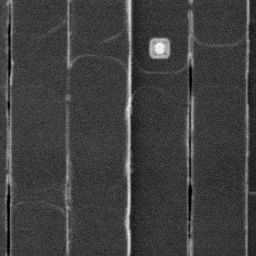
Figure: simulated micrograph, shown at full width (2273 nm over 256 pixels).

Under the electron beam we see wiring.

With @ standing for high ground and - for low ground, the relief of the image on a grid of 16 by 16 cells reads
@@@@@@@@--------
@@@@@@@@--------
@@@@@@@@--------
@@@@@@@@--------
@@@@@@@@--------
@@@@@@@@--------
@@@@@@@@--------
@@@@@@@@--------
@@@@@@@@--------
@@@@@@@@--------
@@@@@@@@--------
@@@@@@@@--------
@@@@@@@@--------
@@@@@@@@--------
@@@@@@@@--------
@@@@@@@@--------